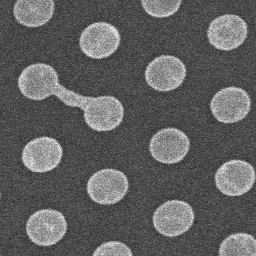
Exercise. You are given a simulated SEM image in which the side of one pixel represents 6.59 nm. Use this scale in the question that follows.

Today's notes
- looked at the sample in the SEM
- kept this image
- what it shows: a regular array of raised bodies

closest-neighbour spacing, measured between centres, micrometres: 0.48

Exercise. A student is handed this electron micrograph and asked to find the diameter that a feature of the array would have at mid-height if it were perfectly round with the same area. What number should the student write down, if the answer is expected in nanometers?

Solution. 243